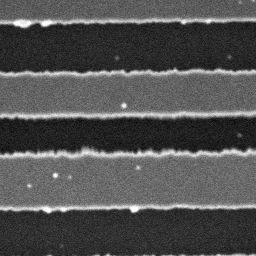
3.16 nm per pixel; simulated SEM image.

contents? lines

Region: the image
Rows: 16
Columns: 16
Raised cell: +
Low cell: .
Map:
++++++++++++++++
.++.............
................
................
.......+++++++++
++++++++++++++++
++++++++++++++++
................
................
..............+.
++++++++++++++++
++++++++++++++++
++++++++++++++++
................
................
................